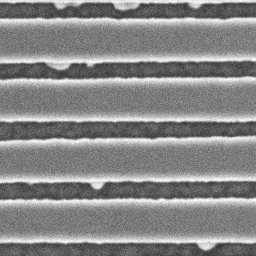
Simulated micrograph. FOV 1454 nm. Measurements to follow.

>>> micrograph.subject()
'lines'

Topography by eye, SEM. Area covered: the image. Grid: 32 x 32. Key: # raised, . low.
.......#......###...............
................................
################################
################################
################################
################################
################################
################################
.......#........................
................................
################################
################################
################################
################################
################################
................................
................................
....############################
################################
################################
################################
################################
################################
................................
................................
################################
################################
################################
################################
################################
.........................##.....
................................